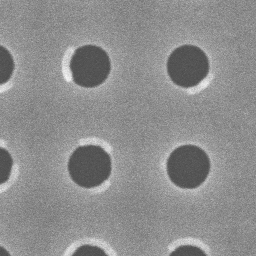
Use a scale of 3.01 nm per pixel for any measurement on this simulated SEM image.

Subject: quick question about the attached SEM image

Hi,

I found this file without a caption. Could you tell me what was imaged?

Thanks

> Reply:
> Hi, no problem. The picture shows holes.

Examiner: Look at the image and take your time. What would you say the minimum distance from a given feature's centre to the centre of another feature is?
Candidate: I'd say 295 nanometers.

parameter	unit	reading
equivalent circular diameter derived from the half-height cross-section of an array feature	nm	132